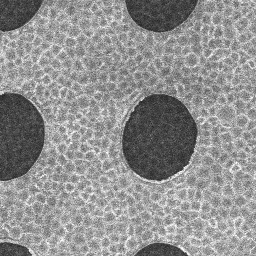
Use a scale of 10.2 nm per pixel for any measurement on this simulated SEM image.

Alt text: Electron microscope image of holes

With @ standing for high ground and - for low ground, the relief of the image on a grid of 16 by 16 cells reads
--@@@@@@----@@@@
--@@@@@@@--@@@@@
@@@@@@@@@@@@@@@@
@@@@@@@@@@@@@@@@
@@@@@@@@@@@@@@@@
@@@@@@@@@@@@@@@@
--@@@@@@@--@@@@@
---@@@@@----@@@@
---@@@@@----@@@@
---@@@@@----@@@@
--@@@@@@---@@@@@
@@@@@@@@@@@@@@@@
@@@@@@@@@@@@@@@@
@@@@@@@@@@@@@@@@
@@@@@@@@@@@@@@@@
--@@@@@@@--@@@@@